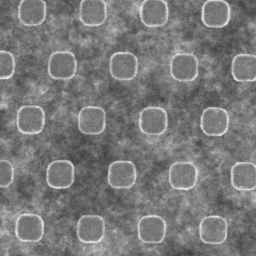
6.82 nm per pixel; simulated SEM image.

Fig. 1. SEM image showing a regular array of raised bodies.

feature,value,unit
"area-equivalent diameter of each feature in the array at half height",195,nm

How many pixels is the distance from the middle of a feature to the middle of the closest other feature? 61.1